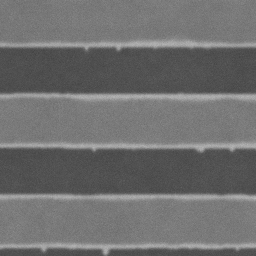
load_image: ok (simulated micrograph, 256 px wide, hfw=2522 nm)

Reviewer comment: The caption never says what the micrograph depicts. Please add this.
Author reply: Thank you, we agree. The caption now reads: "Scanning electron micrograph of lines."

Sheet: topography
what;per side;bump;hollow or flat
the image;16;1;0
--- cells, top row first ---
1111111111111111
1111111111111111
1111111111111111
0000000000000000
0000000000000000
0000000000000000
1111111111111111
1111111111111111
1111111111111111
0000000000000000
0000000000000000
0000000000000000
1111111111111111
1111111111111111
1111111111111111
0000011100000000